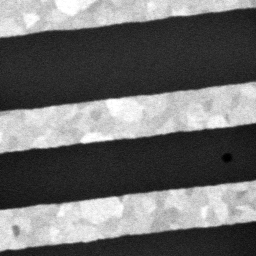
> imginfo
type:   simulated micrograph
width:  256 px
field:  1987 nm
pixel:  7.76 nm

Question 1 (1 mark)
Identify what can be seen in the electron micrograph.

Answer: lines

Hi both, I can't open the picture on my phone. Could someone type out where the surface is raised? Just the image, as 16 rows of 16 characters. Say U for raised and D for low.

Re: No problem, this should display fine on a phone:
UUUUUUUUUUUUUUUD
UUUUUUUDDDDDDDDD
DDDDDDDDDDDDDDDD
DDDDDDDDDDDDDDDD
DDDDDDDDDDDDDDDD
DDDDDDDDDDDDDUUU
DDDDDUUUUUUUUUUU
UUUUUUUUUUUUUUUU
UUUUUUUUUDDDDDDD
DDDDDDDDDDDDDDDD
DDDDDDDDDDDDDDDD
DDDDDDDDDDDDDDUU
DDDDDDUUUUUUUUUU
UUUUUUUUUUUUUUUU
UUUUUUUUUUDDDDDD
UDDDDDDDDDDDDDDD